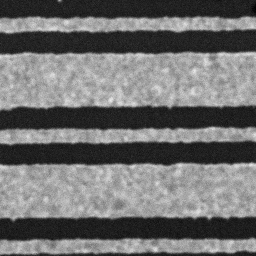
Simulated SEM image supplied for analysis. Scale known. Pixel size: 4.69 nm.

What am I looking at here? lines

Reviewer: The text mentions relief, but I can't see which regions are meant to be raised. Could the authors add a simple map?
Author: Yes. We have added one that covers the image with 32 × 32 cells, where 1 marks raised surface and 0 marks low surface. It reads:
00000000000000000000000000000000
00000000000000000000000000000000
11111111111111111111111111111111
11111111111111111111111111111111
00000000000000000000000000000000
00000000000000000000000000000000
00000000000000000000000000000000
11111111111111111111111111111111
11111111111111111111111111111111
11111111111111111111111111111111
11111111111111111111111111111111
11111111111111111111111111111111
11111111111111111111111111111111
00000000000000000000000000000000
00000000000000000000000000000000
00000000000000000000000000000000
11111111111111111111111111111111
11111111111111111111111111111111
00000000000000000000000000000000
00000000000000000000000000000000
00000000000000000000000000000000
11111111111111111111111111111111
11111111111111111111111111111111
11111111111111111111111111111111
11111111111111111111111111111111
11111111111111111111111111111111
11111111111111111111111111111111
00000000000000000000000000000000
00000000000000000000000000000000
00000000000000000000000000000000
11111111111111111111111111111111
11111111111111111111011111101000